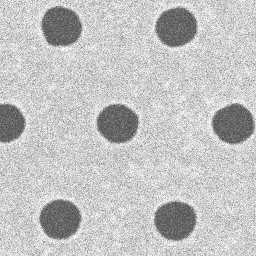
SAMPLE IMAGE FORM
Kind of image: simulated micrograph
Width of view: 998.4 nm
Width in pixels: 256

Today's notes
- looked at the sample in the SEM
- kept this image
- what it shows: holes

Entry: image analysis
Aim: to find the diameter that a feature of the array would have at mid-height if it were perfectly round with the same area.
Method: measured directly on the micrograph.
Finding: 161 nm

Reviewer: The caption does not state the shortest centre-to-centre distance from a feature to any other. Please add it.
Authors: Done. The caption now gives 438 nanometers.